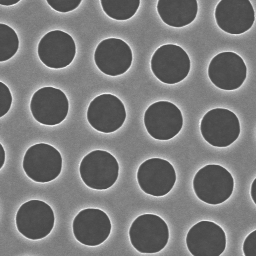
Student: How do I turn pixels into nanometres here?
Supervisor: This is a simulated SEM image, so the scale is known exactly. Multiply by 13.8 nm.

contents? a regular array of holes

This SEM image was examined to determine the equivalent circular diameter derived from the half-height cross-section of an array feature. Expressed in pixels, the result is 38.6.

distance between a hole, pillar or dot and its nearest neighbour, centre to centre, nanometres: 788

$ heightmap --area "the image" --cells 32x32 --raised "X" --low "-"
--XXXX----XXX----XXX-----XX----X
XXXXXXXXXXXXX----XXX-----XX-----
XXXXXXXXXXXXXXXXXXXX----XXX-----
-XXXXXXXXXXXXXXXXXXXXXXXXXXX---X
--XXXX---XXXXXXXXXXXXXXXXXXXXXXX
--XXX----XXX----XXXXXXXXXXXXXXXX
--XXX----XXX----XXX----XXXXXXXXX
-XXXX----XXX----XXX-----XXX---XX
XXXXXXXXXXXX----XXX-----XX-----X
XXXXXXXXXXXXXXXXXXXX---XXX-----X
XXXXXXXXXXXXXXXXXXXXXXXXXXX---XX
-XXXX---XXXXXXXXXXXXXXXXXXXXXXXX
-XXX----XXXX---XXXXXXXXXXXXXXXXX
-XXX-----XX-----XXX---XXXXXXXXXX
XXXX----XXX-----XX-----XXX----XX
XXXXXX-XXXX----XXX-----XX-----XX
XXXXXXXXXXXXX-XXXXX---XXX-----XX
XXXXXXXXXXXXXXXXXXXXXXXXXX---XXX
XXXX---XXXXXXXXXXXXXXXXXXXXXXXXX
-XX-----XXX---XXXXXXXXXXXXXXXXXX
XXX-----XX-----XXX---XXXXXXXXXXX
XXX-----XX-----XX-----XXX---XXXX
XXXX---XXX-----XX-----XX-----XXX
XXXXXXXXXXXX-XXXXX---XXX-----XX-
XXXXXXXXXXXXXXXXXXX-XXXXX----XX-
XXX---XXXXXXXXXXXXXXXXXXXXXXXXXX
XX-----XXX---XXXXXXXXXXXXXXXXXXX
XX-----XX-----XXX---XXXXXXXXXXXX
XX-----XX-----XX-----XXX----XXXX
XXX---XXX----XXX-----XX-----XXX-
XXXXXXXXXXX-XXXXX----XX-----XX--
XXXXXXXXXXXXXXXXXX--XXXX----XX--